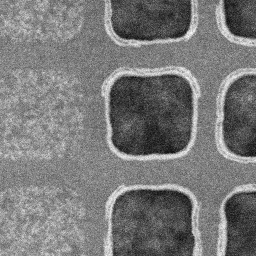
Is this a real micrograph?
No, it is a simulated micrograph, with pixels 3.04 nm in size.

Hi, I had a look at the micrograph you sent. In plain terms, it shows holes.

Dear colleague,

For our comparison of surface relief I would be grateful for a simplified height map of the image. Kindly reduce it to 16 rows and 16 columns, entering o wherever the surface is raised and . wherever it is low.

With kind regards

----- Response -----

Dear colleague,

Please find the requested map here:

ooooooo.....oo..
ooooooo.....oo..
oooooooo...ooooo
oooooooooooooooo
oooooooooooooooo
ooooooo.....oo..
ooooooo.....oo..
ooooooo.....oo..
ooooooo.....oo..
ooooooo....ooo..
oooooooooooooooo
oooooooooooooooo
ooooooo.....oo..
ooooooo.....oo..
ooooooo.....oo..
ooooooo.....oo..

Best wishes